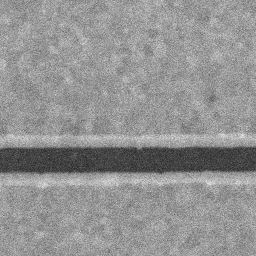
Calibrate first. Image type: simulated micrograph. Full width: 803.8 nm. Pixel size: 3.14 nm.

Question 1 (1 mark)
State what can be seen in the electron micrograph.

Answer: one or a few lines or trenches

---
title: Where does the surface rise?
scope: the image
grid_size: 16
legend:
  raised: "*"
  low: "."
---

****************
****************
****************
****************
****************
****************
****************
****************
****************
................
................
****************
****************
****************
****************
****************